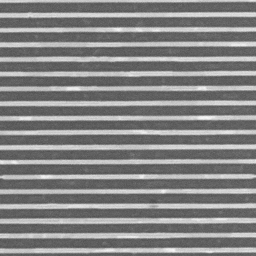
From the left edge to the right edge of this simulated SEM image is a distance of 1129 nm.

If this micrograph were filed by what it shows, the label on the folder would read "parallel lines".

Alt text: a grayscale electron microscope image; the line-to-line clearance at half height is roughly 48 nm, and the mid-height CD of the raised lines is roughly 0.0177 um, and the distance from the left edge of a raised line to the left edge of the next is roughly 64.9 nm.